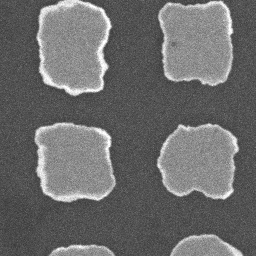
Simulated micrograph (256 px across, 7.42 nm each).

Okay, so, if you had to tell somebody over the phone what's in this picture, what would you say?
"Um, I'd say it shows raised bodies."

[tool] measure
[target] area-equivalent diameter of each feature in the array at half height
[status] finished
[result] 601 nanometres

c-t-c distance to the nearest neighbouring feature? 871 nm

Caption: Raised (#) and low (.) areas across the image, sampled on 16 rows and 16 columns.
...###....####..
..#####...####..
..#####...####..
...###....#####.
...###....####..
....##..........
................
................
..#####....####.
..#####...#####.
...####...#####.
...####...#####.
................
................
................
....###....###..